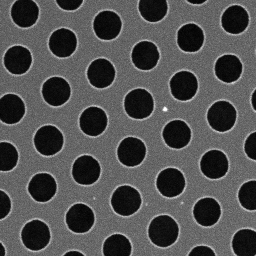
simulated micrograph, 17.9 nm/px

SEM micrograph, a regular array of holes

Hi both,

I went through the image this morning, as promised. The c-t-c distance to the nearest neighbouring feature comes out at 853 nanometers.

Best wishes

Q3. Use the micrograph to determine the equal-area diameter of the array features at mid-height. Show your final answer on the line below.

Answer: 519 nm